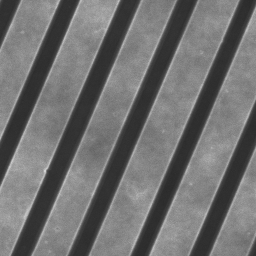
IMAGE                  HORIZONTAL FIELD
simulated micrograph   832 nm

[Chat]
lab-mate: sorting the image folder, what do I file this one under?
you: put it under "parallel lines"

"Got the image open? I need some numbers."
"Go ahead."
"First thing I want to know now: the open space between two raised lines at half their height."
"15.6 px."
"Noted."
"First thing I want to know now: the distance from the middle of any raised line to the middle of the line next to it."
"178 nm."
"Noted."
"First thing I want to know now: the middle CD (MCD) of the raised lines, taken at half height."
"127 nm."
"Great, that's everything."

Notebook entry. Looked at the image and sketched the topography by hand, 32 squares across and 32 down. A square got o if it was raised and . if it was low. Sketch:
..oooooo..ooooo..ooooo..oooooo..
..ooooo..ooooo...ooooo..oooooo.o
.oooooo..ooooo..ooooo..oooooo..o
.ooooo..oooooo..ooooo..oooooo..o
.ooooo..ooooo...oooo...ooooo..oo
ooooo..oooooo..ooooo..oooooo..oo
ooooo..ooooo...ooooo..ooooo..ooo
ooooo..ooooo..ooooo..oooooo..ooo
oooo..ooooo...ooooo..oooooo.oooo
oooo..ooooo..ooooo..oooooo..oooo
ooo..oooooo..ooooo..oooooo..oooo
ooo..ooooo...oooo...ooooo..ooooo
oo..oooooo..ooooo..oooooo..ooooo
oo..ooooo...ooooo..ooooo..oooooo
oo..ooooo..ooooo..oooooo..ooooo.
o..ooooo...ooooo..oooooo.oooooo.
o..ooooo..ooooo..oooooo..ooooo..
..oooooo..ooooo..oooooo..ooooo..
..ooooo...oooo...ooooo..oooooo..
.oooooo..ooooo..oooooo..ooooo..o
.ooooo...ooooo..ooooo..oooooo..o
.ooooo..ooooo..oooooo..ooooo..oo
oooooo..ooooo..oooooo.oooooo..oo
ooooo..ooooo..oooooo..ooooo...oo
ooooo..ooooo..oooooo..ooooo..ooo
oooo...ooooo..ooooo..oooooo..ooo
oooo..ooooo..oooooo..ooooo..oooo
ooo...ooooo..ooooo..oooooo..oooo
ooo..ooooo..oooooo..ooooo...oooo
ooo..ooooo..oooooo.oooooo..ooooo
oo..ooooo..oooooo..ooooo...ooooo
oo..ooooo..oooooo..ooooo..ooooo.